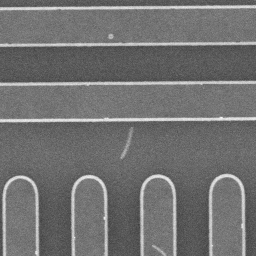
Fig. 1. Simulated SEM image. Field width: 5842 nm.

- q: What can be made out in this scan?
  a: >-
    groups of lines, slits or small figures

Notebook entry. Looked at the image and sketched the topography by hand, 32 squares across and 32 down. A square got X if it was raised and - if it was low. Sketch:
--------------------------------
XXXXXXXXXXXXXXXXXXXXXXXXXXXXXXXX
XXXXXXXXXXXXXXXXXXXXXXXXXXXXXXXX
XXXXXXXXXXXXXXXXXXXXXXXXXXXXXXXX
XXXXXXXXXXXXXXXXXXXXXXXXXXXXXXXX
XXXXXXXXXXXX--------------------
--------------------------------
--------------------------------
--------------------------------
--------------------------------
-----------XXXXXXXXXXXXXXXXXXXXX
XXXXXXXXXXXXXXXXXXXXXXXXXXXXXXXX
XXXXXXXXXXXXXXXXXXXXXXXXXXXXXXXX
XXXXXXXXXXXXXXXXXXXXXXXXXXXXXXXX
XXXXXXXXXXXXXXXXXXXXXXXXXXXXXXXX
--------------------------------
--------------------------------
--------------------------------
--------------------------------
--------------------------------
--------------------------------
--------------------------------
-XXX------XX-------XX------XXX--
-XXX-----XXXX-----XXXX----XXXX--
-XXXX----XXXX-----XXXX----XXXX--
-XXXX----XXXX-----XXXX----XXXX--
-XXXX----XXXX-----XXXX----XXXX--
-XXXX----XXXX-----XXXX----XXXX--
-XXXX----XXXX-----XXXX----XXXX--
-XXXX----XXXX-----XXXX----XXXX--
-XXXX----XXXX-----XXXX----XXXX--
-XXXX----XXXX-----XXXX----XXXX--